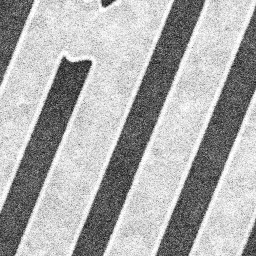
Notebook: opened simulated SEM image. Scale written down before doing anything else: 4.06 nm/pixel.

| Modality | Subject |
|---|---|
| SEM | one or a few lines or trenches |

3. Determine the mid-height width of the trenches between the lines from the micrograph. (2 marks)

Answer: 136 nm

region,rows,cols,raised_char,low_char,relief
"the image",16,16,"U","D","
DDUUUUUUUUUDDUUU
DDUUUUUUUUDDUUUD
DUUUUUUUUUDDUUUD
DUUUUUUUUDDDUUUD
UUUDDDUUUDDUUUDD
UUUDDUUUUDDUUUDD
UUUDDUUUDDUUUDDD
UUDDUUUUDDUUUDDU
UUDDUUUDDDUUUDDU
UDDDUUUDDUUUDDDU
UDDUUUUDDUUUDDUU
UDDUUUDDUUUDDDUU
DDUUUUDDUUUDDUUU
DDUUUDDDUUUDDUUU
DDUUUDDUUUDDDUUU
DUUUUDDUUUDDUUUD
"